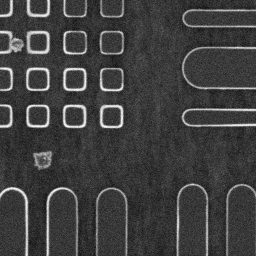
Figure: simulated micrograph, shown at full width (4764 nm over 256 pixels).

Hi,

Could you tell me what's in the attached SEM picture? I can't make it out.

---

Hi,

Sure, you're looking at groups of lines, slits or small figures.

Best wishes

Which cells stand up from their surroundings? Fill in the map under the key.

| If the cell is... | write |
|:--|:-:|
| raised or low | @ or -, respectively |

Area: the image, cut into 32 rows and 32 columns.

@---@@--@@@--@@-----------------
@---@@--@@@--@@--------@@@@@@@@@
-----------------------@@@@@@@@@
--------------------------------
@---@@--@@@--@@-----------------
@@@-@@--@@@--@@-----------------
@---@@--@@---@@---------@@@@@@@@
-----------------------@@@@@@@@@
-----------------------@@@@@@@@@
@--@@@--@@@--@@--------@@@@@@@@@
@--@@@--@@@--@@---------@@@@@@@@
--------------------------------
--------------------------------
@---@@--@@---@@-----------------
@--@@@--@@@--@@--------@@@@@@@@@
@---@@--@@---@@--------@@@@@@@@@
--------------------------------
--------------------------------
--------------------------------
--------------------------------
--------------------------------
--------------------------------
--------------------------------
-----------------------@@----@@-
@@@---@@@---@@@@------@@@@--@@@@
@@@---@@@@--@@@@------@@@@--@@@@
@@@---@@@@--@@@@------@@@@--@@@@
@@@---@@@@--@@@@------@@@@--@@@@
@@@---@@@@--@@@@------@@@@--@@@@
@@@---@@@@--@@@@------@@@@--@@@@
@@@---@@@@--@@@@------@@@@--@@@@
@@@---@@@@--@@@@------@@@@--@@@@